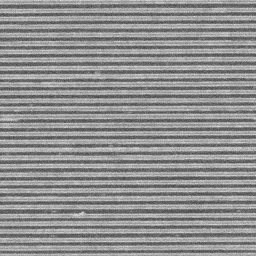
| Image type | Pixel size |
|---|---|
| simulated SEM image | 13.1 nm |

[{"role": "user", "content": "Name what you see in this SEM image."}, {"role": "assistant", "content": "parallel lines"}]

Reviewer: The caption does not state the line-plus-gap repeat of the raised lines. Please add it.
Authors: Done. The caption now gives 107 nanometers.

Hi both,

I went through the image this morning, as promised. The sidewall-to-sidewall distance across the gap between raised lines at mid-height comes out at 0.0639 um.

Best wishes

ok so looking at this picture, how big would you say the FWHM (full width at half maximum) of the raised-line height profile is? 39.3 nm